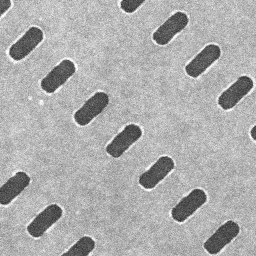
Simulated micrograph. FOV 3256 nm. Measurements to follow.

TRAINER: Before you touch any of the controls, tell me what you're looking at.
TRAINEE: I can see a regular array of holes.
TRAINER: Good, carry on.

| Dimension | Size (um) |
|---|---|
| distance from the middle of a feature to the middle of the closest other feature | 0.581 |